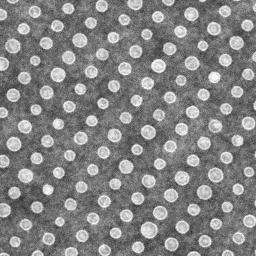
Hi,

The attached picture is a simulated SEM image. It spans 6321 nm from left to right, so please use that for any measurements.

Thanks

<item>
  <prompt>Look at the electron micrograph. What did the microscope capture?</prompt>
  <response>a regular array of raised bodies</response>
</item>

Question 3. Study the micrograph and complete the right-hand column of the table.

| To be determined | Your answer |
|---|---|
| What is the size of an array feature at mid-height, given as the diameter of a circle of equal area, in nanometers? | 270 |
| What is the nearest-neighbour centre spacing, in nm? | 503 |